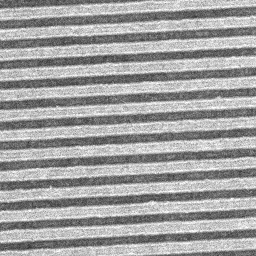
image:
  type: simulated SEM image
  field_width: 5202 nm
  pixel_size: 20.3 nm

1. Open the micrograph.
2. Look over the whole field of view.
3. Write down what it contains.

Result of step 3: parallel lines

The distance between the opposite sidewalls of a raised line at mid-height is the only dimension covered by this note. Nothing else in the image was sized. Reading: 213 nm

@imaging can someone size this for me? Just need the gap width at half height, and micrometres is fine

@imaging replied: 0.198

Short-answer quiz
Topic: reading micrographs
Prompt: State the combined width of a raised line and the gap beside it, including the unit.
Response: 410 nm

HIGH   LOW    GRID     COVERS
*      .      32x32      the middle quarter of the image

...*****************************
********************************
***********.....................
................................
..........................******
.......*************************
*****************************.**
***********.....................
................................
...........................***.*
........************************
*******************************.
************....................
................................
........................*...****
......*...**********************
********************************
**************..................
................................
..........................******
.........***********************
********************************
****************................
................................
...........................*****
.........***********************
********************************
*****************...............
.*..............................
..............................*.
..........*...******************
********************************